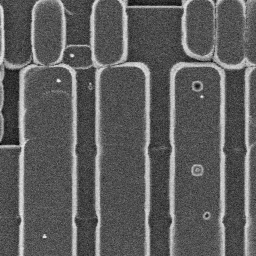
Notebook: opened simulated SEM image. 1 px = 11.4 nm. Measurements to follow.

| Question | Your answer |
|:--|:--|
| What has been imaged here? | wiring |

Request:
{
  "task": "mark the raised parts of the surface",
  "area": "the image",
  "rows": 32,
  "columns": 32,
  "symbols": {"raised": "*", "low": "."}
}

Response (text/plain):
.....***....***........*********
....****....****.......*********
....****....****.......*********
....****....****.......*********
....****....****.......*********
....****....****.......*********
....****....****.......*********
....****....***............*****
....*****...******....******...*
...******...******....******...*
...******...******....******...*
...******...******....******...*
...******...******....******...*
...******...******....******...*
...******...******....******...*
...******...******...*******...*
...******...******...*******...*
...******...******...*******...*
...******...******....******...*
...******...******....******...*
...******...******...*******...*
...******...******...***.***...*
...******...******...*******...*
...******...******...*******...*
...******...******...*******...*
...******...******...*******...*
...******...******...*******...*
...******...******....******...*
...******...******...*******...*
...******...******...*******...*
...******...******...*******...*
...******...******...*******...*